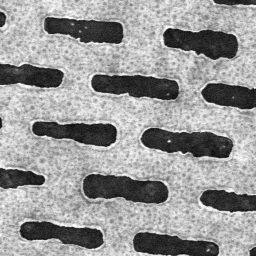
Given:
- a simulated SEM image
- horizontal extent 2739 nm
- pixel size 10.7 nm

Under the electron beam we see holes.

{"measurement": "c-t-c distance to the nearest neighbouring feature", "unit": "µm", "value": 0.814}